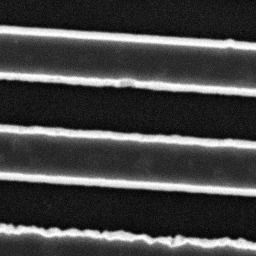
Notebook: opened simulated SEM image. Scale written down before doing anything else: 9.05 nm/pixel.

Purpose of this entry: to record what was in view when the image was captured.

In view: one or a few lines or trenches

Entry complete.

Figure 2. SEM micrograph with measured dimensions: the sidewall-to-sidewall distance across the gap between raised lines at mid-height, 458 nanometers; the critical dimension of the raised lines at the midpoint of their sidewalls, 436 nm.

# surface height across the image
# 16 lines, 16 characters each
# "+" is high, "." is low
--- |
................
................
+++++++++++.....
++++++++++++++++
++++++++++++++++
...........+++++
................
................
+++++++.........
++++++++++++++++
++++++++++++++++
.......+++++++++
................
................
+++.............
++++++++++++++++